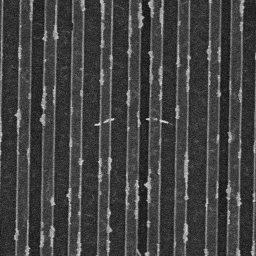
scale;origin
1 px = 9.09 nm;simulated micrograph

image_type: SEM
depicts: parallel lines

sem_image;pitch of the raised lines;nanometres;240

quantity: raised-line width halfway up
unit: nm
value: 107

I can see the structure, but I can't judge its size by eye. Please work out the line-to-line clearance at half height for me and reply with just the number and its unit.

0.14 um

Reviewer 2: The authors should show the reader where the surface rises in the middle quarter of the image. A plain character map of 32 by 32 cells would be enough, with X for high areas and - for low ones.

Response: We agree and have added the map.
--XXX----XXX----XXX---XX----XXX-
--XXX----XXX----XXX---XX----XXX-
--XXX----XXX----XXX---XX----XXX-
--XXX----XXX----XXX--XXXX---XXX-
--XXX----XXX----XXX--XXX----XXX-
--XXX----XXX----XXX---XX----XXX-
--XXX----XXX----XXX---XX----XXX-
--XXX----XXX----XXX---XX----XXX-
--XX-----XXX----XXX---XX----XXX-
--XX-----XXX----XXX---XX----XXX-
--XX-----XXX----XXX---XX----XXX-
--XX-----XXX----XXX---XX----XXX-
--XX-----XXX----XXX---XX----XXX-
--XX-----XXX----XXX--XXX----XXX-
--XX-----XXX----XXX---XXX---XXX-
--XX-----XXX----XXX---XX----XXX-
--XX-----XX-----XXX--XXX----XXX-
--XX-----XX-----XXX--XXX----XXX-
--XX-----XX-----XXX--XXX----XXX-
-XXX-----XX-----XXX--XXX----XXX-
-XXX-----XX-----XXX--XXX----XXX-
--XX-----XX-----XXX--XXX----XXX-
--XX-----XX-----XXX--XXX----XXX-
--XX-----XXX----XXX--XXX----XXX-
--XXX----XXX----XXX--XXX----XXX-
--XX-----XXX----XXX--XXX----XXX-
--XX-----XXX----XXX--XXX----XXX-
--XX-----XX-----XXX--XXX----XXX-
--XX-----XX-----XX---XXX----XXX-
--XX-----XX-----XXX--XXX----XXX-
-XXX-----XX-----XXX-XXXX----XXX-
-XXX-----XX----XXX---XXX----XXX-